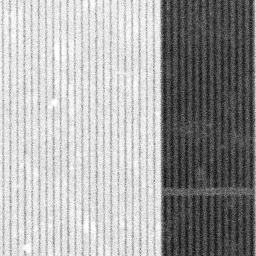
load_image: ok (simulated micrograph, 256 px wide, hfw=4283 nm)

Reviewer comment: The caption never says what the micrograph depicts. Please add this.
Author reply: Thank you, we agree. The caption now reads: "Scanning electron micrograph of parallel lines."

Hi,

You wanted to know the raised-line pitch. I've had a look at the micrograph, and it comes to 120 nm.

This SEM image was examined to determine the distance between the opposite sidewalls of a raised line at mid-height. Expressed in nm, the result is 85.7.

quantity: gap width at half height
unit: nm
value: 37.6